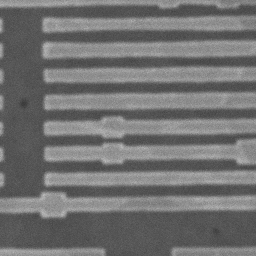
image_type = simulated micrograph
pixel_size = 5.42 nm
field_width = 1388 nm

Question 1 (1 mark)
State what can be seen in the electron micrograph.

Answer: wiring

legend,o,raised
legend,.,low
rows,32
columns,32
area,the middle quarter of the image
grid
................................
.......ooooooooooo..oooooooooooo
oooooooooooooooooooooooooooooooo
oooooooooooooooooooooooooooooooo
................................
................................
................................
................................
oooooooooooooooooooooooooooooooo
oooooooooooooooooooooooooooooooo
oooooooooooooooooooooooooooooooo
................................
................................
................................
.....ooooooooooooooooooooooooooo
oooooooooooooooooooooooooooooooo
oooooooooooooooooooooooooooooooo
.........oooooo.................
................................
................................
..........ooooo.................
oooooooooooooooooooooooooooooooo
oooooooooooooooooooooooooooooooo
oooooooooooooooooooooooooooooooo
..........ooooo.................
................................
................................
...ooooooooooooooooooooooooooooo
oooooooooooooooooooooooooooooooo
oooooooooooooooooooooooooooooooo
................................
................................